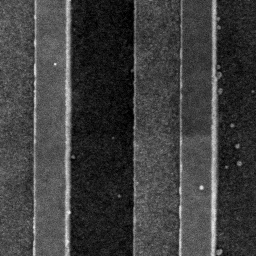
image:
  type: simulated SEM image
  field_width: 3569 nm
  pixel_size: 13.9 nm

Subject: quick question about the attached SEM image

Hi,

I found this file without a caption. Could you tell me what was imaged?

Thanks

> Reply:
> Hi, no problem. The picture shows lines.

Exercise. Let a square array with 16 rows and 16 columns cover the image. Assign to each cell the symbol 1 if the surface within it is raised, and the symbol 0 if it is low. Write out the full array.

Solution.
1111000011111000
1111000011111000
1111000011111000
1111000011111000
1111000011111000
1111000011111000
1111000011111000
1111000011111000
1111000011111000
1111000011111000
1111000011111000
1111000011111000
1111000011111000
1111000011111000
1111000011111000
1111000011111000